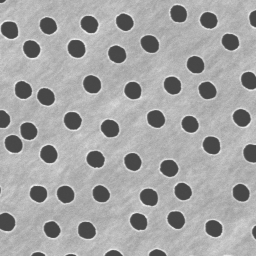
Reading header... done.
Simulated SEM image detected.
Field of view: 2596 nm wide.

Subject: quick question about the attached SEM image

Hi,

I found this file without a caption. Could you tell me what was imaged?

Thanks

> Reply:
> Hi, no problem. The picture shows a regular array of holes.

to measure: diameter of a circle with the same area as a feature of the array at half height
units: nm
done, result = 180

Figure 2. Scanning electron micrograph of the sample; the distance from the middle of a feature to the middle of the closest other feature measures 308 nm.